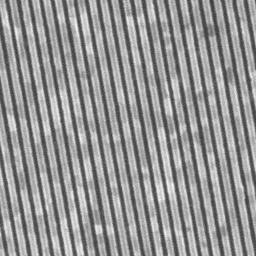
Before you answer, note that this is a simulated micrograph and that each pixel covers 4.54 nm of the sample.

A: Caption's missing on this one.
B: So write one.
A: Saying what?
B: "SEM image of parallel lines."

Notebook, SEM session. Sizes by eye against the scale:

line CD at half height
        24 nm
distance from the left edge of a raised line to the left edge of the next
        50.6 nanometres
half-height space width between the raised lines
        24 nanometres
